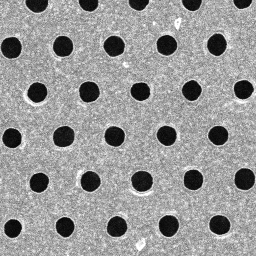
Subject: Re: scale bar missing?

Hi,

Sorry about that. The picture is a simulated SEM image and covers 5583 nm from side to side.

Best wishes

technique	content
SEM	a regular array of holes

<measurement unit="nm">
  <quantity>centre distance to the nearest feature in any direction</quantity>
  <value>1120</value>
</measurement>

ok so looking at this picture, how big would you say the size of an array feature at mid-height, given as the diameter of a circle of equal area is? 0.446 um